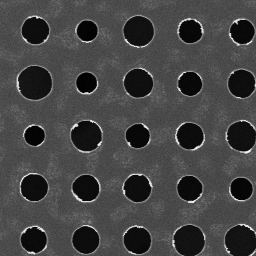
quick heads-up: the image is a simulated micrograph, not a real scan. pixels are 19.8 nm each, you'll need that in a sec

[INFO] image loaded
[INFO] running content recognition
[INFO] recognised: a regular array of holes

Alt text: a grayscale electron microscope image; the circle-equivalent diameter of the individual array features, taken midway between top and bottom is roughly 26.4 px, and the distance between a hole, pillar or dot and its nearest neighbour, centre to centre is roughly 1.02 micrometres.